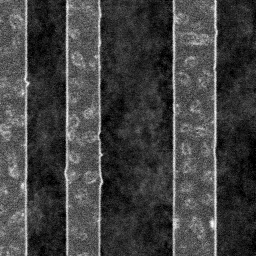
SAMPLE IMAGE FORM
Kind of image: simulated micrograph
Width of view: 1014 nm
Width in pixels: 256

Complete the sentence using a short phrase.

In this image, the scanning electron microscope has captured one or a few lines or trenches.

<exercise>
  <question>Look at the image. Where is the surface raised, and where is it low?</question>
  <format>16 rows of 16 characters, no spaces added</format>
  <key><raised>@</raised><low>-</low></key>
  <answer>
@@--@@-----@@---
@@--@@-----@@@--
@@--@@-----@@@--
@@--@@-----@@---
@@--@@-----@@---
@@--@@-----@@---
@@--@@-----@@---
@@--@@-----@@---
@@--@@-----@@---
@@--@@-----@@---
@@--@@-----@@---
@@--@@-----@@---
@@--@@-----@@---
@@--@@-----@@---
@@--@@-----@@---
@@--@@-----@@---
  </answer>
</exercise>